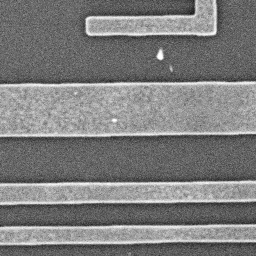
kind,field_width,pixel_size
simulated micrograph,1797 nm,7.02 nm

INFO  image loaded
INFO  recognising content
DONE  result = wiring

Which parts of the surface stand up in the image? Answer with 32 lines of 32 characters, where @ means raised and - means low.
-------------------------@@-----
------------------------@@@-----
-----------@@@@@@@@@@@@@@@@-----
-----------@@@@@@@@@@@@@@@@-----
--------------------------------
--------------------------------
--------------------------------
--------------------------------
--------------------------------
--------------------------------
--------------@@@@@@@@@@@@@@@@@@
@@@@@@@@@@@@@@@@@@@@@@@@@@@@@@@@
@@@@@@@@@@@@@@@@@@@@@@@@@@@@@@@@
@@@@@@@@@@@@@@@@@@@@@@@@@@@@@@@@
@@@@@@@@@@@@@@@@@@@@@@@@@@@@@@@@
@@@@@@@@@@@@@@@@@@@@@@@@@@@@@@@@
@@@@@@@@@@@@@@@@@@@@@@@@@@@@@@@@
--------------------------------
--------------------------------
--------------------------------
--------------------------------
--------------------------------
--------------------------------
@@@@@@@@@@@@@@@@@@@@@@@@@@@@@@@@
@@@@@@@@@@@@@@@@@@@@@@@@@@@@@@@@
--------------------------------
--------------------------------
--------------------------------
@@@@@@@@@@@@@@@@@@@@@@@@@@@@@@@@
@@@@@@@@@@@@@@@@@@@@@@@@@@@@@@@@
@@@@@---------------------------
--------------------------------